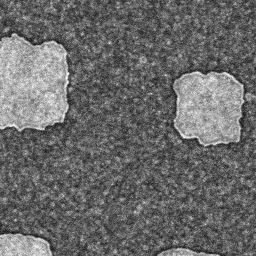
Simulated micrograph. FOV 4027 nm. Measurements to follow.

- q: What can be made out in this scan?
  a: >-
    raised bodies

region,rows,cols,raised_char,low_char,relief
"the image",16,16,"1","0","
0000000000000000
0000000000000000
1100000000000000
1111000000000000
1111000000000000
1111000000011110
1111000000011110
1111000000011110
0000000000001110
0000000000000000
0000000000000000
0000000000000000
0000000000000000
0000000000000000
0000000000000000
1110000000000000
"